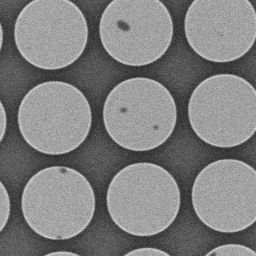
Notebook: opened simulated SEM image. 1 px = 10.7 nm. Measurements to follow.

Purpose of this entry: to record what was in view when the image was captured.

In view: an array of small figures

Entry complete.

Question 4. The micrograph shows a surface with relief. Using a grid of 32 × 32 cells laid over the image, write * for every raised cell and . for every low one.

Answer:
....*****.....******....*******.
...*******...********..*********
..*********..********..*********
..*********..*********.*********
..*********..********..*********
..*********..********...********
...*******...********....******.
...******......****.......***...
.....**.........................
...........................**...
.....***.......*****.....******.
....******....*******...********
...********..*********..********
..*********..*********..********
*.*********..*********..********
*.*********..*********..********
*..********...*******...********
...*******....*******....******.
....*****.......***.............
................................
.................**.......*****.
.....*****.....******....*******
....*******...********..********
*..********...********..********
*..*********.*********..********
*..*********.*********..********
*..*********..********..********
*..********...********...*******
....*******....******......****.
.....****.......................
................................
................****......******